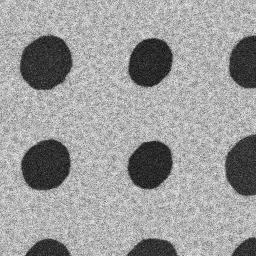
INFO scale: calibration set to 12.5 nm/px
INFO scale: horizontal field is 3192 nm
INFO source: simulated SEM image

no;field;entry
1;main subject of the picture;holes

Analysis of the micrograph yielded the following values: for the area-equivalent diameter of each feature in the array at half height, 604 nm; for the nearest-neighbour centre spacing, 1.28 microns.